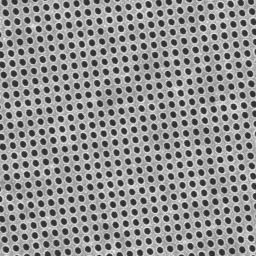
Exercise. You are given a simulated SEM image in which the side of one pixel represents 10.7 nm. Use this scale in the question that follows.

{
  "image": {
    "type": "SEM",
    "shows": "a regular array of holes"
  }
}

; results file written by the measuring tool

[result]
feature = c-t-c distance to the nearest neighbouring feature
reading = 106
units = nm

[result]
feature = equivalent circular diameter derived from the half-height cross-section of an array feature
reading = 0.0721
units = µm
